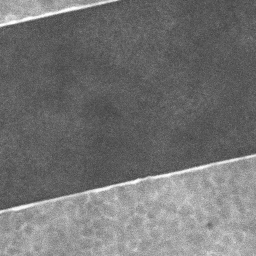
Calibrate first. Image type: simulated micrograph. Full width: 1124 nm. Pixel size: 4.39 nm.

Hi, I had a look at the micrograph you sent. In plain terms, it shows one or a few lines or trenches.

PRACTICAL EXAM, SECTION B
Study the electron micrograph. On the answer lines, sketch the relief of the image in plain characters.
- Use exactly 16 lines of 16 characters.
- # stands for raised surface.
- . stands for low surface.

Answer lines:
#####...........
#...............
................
................
................
................
................
................
................
................
............####
.......#########
...#############
################
################
################